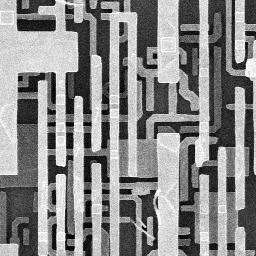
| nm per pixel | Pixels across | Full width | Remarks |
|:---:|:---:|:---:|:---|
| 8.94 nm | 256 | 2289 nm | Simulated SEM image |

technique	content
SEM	wiring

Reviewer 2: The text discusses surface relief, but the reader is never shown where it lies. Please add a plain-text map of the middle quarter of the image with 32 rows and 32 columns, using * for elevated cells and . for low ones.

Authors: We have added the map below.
***....**...**..**......*****...
***....**...**..**......*****...
.......**...**..**......*****...
.......**...**..**......*****...
.......**...**..**..............
.......**...**..**..............
.......**...**..**..............
.......**...**..**..............
...**..**...**..**..............
...**..**...**..**..............
...**..**...**..**..............
...**..**...**..**..............
...**..**...**..**..............
...**..**...**..**..............
...**..**...**..**..............
...**..**...**..**..............
...**..**...**..**..............
...**..**...**..**......*****...
...**..**...*...**.....******...
...**..**...*...**.....******...
...**..**...*...**.....******...
...**..*....*...**.....******...
...**.......**..**.....******...
...**.......**..**......*****...
...**.......**..**......*****...
...**..**...**..**......*****...
...**..**...**..**......*****...
...**..**...**..**......*****...
...**..**...**..........*****...
...**..**...**..........*****...
...**..**...**..........*****...
...**..**...**.........******...